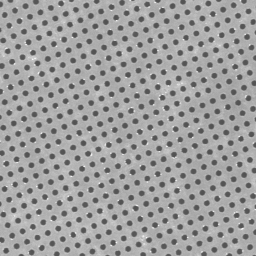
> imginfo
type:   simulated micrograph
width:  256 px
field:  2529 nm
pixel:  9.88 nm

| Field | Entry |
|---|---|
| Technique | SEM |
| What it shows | a regular array of holes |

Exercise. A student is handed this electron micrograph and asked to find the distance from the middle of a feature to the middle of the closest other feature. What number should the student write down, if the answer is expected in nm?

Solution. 110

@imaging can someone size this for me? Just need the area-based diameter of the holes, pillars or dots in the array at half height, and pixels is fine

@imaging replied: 5.53